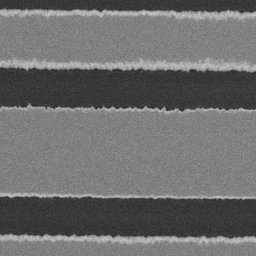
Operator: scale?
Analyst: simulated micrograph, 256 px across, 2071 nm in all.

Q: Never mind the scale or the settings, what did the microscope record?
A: lines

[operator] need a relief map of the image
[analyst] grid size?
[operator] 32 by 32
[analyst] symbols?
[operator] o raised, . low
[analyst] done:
................................
oooooooooooooooooooooo.ooo.ooo..
oooooooooooooooooooooooooooooooo
oooooooooooooooooooooooooooooooo
oooooooooooooooooooooooooooooooo
oooooooooooooooooooooooooooooooo
oooooooooooooooooooooooooooooooo
oooooooooooooooooooooooooooooooo
...o..ooo.oooooooooooooooooooooo
................................
................................
................................
................................
oooooo..........................
oooooooooooooooooooooooooooooooo
oooooooooooooooooooooooooooooooo
oooooooooooooooooooooooooooooooo
oooooooooooooooooooooooooooooooo
oooooooooooooooooooooooooooooooo
oooooooooooooooooooooooooooooooo
oooooooooooooooooooooooooooooooo
oooooooooooooooooooooooooooooooo
oooooooooooooooooooooooooooooooo
oooooooooooooooooooooooooooooooo
oooooooooooooooooooooooooooooooo
................................
................................
................................
................................
oooooo.o...o....................
oooooooooooooooooooooooooooooooo
oooooooooooooooooooooooooooooooo